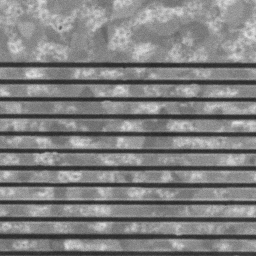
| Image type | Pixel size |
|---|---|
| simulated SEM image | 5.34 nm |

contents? parallel lines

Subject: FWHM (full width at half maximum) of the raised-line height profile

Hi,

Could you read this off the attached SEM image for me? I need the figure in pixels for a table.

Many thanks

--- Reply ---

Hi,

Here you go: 12.1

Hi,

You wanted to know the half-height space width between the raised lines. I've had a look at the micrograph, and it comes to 0.03 um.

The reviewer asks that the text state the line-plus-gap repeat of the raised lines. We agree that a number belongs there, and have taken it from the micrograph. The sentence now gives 0.0915 µm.